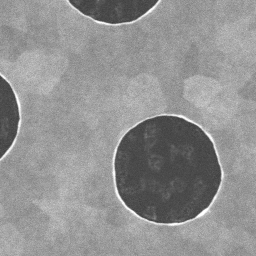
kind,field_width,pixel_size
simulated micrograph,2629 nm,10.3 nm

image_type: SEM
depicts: holes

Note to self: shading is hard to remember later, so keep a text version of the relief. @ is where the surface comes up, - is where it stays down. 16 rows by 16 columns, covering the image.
@@@@@-----@@@@@@
@@@@@@@@@@@@@@@@
@@@@@@@@@@@@@@@@
@@@@@@@@@@@@@@@@
@@@@@@@@@@@@@@@@
-@@@@@@@@@@@@@@@
-@@@@@@@@@@@@@@@
-@@@@@@@@---@@@@
-@@@@@@@-----@@@
@@@@@@@------@@@
@@@@@@@-------@@
@@@@@@@-------@@
@@@@@@@@-----@@@
@@@@@@@@@---@@@@
@@@@@@@@@@@@@@@@
@@@@@@@@@@@@@@@@